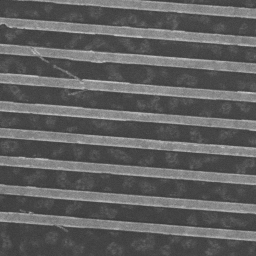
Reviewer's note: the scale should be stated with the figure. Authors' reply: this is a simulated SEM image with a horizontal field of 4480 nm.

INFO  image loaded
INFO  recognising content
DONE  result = parallel lines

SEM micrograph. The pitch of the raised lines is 0.485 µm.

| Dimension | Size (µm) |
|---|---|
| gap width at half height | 0.336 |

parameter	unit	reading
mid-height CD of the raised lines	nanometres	153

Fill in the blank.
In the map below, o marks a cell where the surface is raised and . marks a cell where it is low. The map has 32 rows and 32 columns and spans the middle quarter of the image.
..........................oooooo
................................
................................
................................
oooooooooo......................
ooooooooooooooooooooooo.........
..........oooooooooooooooooooooo
.......................ooooooooo
................................
................................
................................
oooooooooo......................
oooooooooooooooooooo.oo.........
..........oooooooooooooooooooooo
.......................ooooooooo
................................
................................
oo..............................
ooooooooooooooo.................
..ooooooooooooooooooooooo.......
.............o.ooooooooooooooooo
.........................oo.oooo
................................
................................
oo..............................
ooooooooooooooo.................
..oooooooooooooooooooooooooo....
...............ooooooooooooooooo
............................oooo
................................
................................
................................